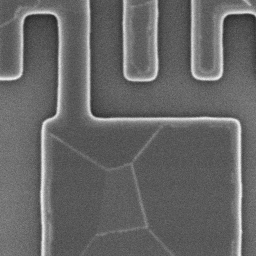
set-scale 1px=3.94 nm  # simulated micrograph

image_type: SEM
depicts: wiring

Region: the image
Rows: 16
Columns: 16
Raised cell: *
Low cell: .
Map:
******..**..****
*...**..**..**..
*...**..**..**..
*...**..**..**..
*...**..**..**..
....**..........
....**..........
...************.
...************.
...************.
...************.
...************.
...************.
...************.
...************.
...************.